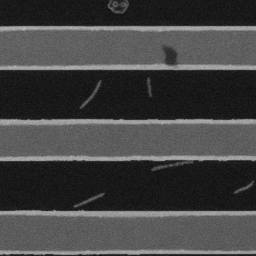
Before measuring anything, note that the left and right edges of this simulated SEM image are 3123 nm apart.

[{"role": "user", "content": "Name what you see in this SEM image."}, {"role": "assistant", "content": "lines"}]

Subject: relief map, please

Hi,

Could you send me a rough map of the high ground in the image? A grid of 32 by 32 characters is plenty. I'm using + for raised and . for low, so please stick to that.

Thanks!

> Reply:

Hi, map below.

................................
................................
................................
...++++++++.++............+.....
++++++++++++++++++++++++++++++++
++++++++++++++++++++++++++++++++
++++++++++++++++++++++++++++++++
++++++++++++++++++++++++++++++++
+++.+...........................
................................
................................
................................
................................
................................
................................
++++++++++++++++++++++++++++++++
++++++++++++++++++++++++++++++++
++++++++++++++++++++++++++++++++
++++++++++++++++++++++++++++++++
++++++++++++++++++++++++++++++++
................................
................................
................................
................................
................................
................................
................................
++++++++++++++++++++++++++++++++
++++++++++++++++++++++++++++++++
++++++++++++++++++++++++++++++++
++++++++++++++++++++++++++++++++
++++++++++++++++++++++++++++++++